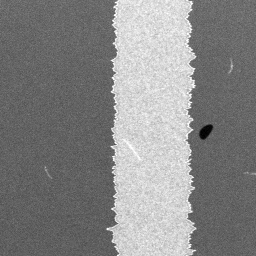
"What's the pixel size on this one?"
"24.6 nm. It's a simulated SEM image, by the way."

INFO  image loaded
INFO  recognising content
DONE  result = one or a few lines or trenches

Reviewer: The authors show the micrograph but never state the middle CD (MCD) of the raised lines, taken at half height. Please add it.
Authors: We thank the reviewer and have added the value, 1800 nanometers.